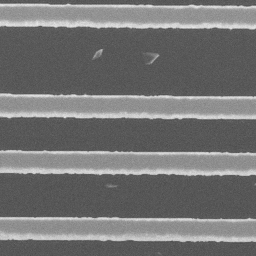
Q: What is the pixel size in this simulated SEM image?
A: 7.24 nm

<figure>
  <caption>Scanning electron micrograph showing lines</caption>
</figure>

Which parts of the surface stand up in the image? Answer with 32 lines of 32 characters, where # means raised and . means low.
................................
################################
################################
................................
................................
................................
................................
................................
................................
................................
................................
................................
################################
################################
##...##.########################
................................
................................
................................
................................
################################
################################
..##############################
................................
................................
................................
................................
................................
################################
################################
################################
................................
................................